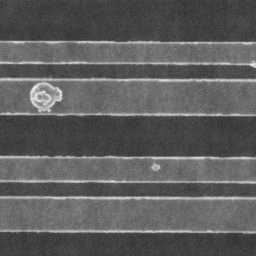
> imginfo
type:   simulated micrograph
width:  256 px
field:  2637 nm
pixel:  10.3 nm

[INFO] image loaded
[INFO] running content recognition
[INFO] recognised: lines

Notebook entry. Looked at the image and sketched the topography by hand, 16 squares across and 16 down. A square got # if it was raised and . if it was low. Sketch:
................
................
................
################
################
################
################
................
................
................
################
################
################
################
...##.##########
................